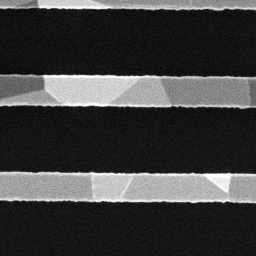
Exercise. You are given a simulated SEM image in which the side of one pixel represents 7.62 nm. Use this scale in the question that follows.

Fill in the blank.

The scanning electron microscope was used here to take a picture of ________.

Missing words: lines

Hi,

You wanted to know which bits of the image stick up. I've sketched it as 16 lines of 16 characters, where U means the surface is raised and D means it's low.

UUDUUUUUUUUUUUUU
DDDDDDDDDDDDDDDD
DDDDDDDDDDDDDDDD
DDDDDDDDDDDDDDDD
DDDDDDDDDDDDDDDD
UUUUUUUUUUUUUUUU
UUUUUUUUUUUUUUUU
DDDDDDDDDDDDDDDD
DDDDDDDDDDDDDDDD
DDDDDDDDDDDDDDDD
DDDDDDDDDDDDDDDD
UUUUUUUUUUUUUUUU
UUUUUUUUUUUUUUUU
DDDDDDDDDDDDDDDD
DDDDDDDDDDDDDDDD
DDDDDDDDDDDDDDDD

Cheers